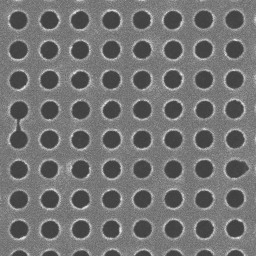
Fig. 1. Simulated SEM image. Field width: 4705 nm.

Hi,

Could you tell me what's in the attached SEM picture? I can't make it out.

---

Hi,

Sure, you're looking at a regular array of holes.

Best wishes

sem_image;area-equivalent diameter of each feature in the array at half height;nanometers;339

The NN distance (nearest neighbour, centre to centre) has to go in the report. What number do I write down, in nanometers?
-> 547